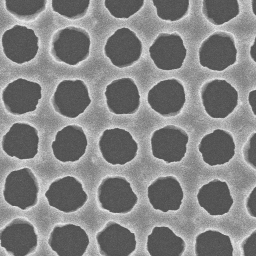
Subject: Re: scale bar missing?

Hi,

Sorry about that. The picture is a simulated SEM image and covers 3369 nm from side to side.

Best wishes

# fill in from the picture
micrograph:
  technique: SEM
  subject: a regular array of holes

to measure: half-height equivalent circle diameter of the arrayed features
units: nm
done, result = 486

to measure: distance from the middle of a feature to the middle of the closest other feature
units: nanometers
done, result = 606